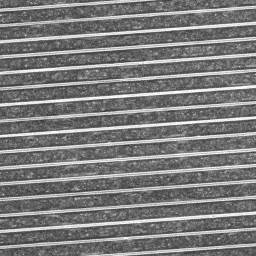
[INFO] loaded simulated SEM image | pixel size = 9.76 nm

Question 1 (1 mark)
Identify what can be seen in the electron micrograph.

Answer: parallel lines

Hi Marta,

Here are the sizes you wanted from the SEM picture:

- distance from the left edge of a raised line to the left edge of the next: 154 nm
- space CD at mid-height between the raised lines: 0.134 micrometres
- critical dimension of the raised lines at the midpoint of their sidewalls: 18.3 nm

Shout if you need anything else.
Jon